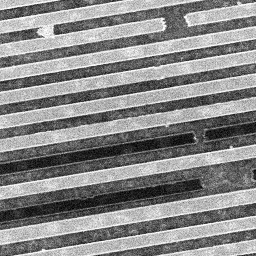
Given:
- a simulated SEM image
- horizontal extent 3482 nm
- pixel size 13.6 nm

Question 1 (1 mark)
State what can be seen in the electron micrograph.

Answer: parallel lines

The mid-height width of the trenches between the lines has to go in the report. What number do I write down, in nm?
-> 158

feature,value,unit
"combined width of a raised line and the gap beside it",316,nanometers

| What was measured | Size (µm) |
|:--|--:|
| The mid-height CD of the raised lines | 0.158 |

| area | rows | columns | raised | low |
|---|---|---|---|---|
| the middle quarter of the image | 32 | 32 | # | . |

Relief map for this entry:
######..................########
..................##############
............##################..
......###################.......
##################..............
############..................##
######..................########
..................##############
............#################...
......#################.........
#################...............
###########...................##
#####...................########
.................###############
...........#################....
.....#################..........
################................
##########...................###
####...................#########
.................###############
...........##################...
....###################.........
#################...............
###########..................###
#####..................#########
.................###############
...........#################....
....##################..........
################................
##########..................####
####..................##########
................################